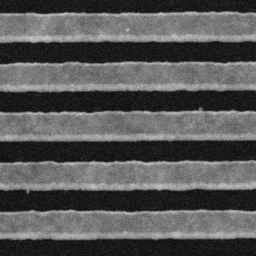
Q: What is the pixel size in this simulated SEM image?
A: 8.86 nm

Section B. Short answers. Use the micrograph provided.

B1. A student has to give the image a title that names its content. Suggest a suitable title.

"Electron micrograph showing lines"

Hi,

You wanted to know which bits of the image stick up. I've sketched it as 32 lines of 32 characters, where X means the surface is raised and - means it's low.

--------------------------------
--------------------------------
XXXXXXXXXXXXXXXXXXXXXXXXXXXXXXXX
XXXXXXXXXXXXXXXXXXXXXXXXXXXXXXXX
XXXXXXXXXXXXXXXXXXXXXXXXXXXXXXXX
--------------------------------
--------------------------------
--------------------------------
XXXXXXXXXXXXXXXXXXXXXXXXXXXXXXXX
XXXXXXXXXXXXXXXXXXXXXXXXXXXXXXXX
XXXXXXXXXXXXXXXXXXXXXXXXXXXXXXXX
--------------------------------
--------------------------------
--------------------------------
XXXXXXXXXXXXXXXXXXXXXXXXXXXXXXXX
XXXXXXXXXXXXXXXXXXXXXXXXXXXXXXXX
XXXXXXXXXXXXXXXXXXXXXXXXXXXXXXXX
--------------------------------
--------------------------------
--------------------------------
XXXXXXXXXXXXXXXXXXXXXXXXXXXXXXXX
XXXXXXXXXXXXXXXXXXXXXXXXXXXXXXXX
XXXXXXXXXXXXXXXXXXXXXXXXXXXXXXXX
XXXXXXXXXXXXXXXXXXXXXXXX-XXXXXXX
--------------------------------
--------------------------------
--XXXXXXXXXXXXXX-XXXXXXXXXXXXXXX
XXXXXXXXXXXXXXXXXXXXXXXXXXXXXXXX
XXXXXXXXXXXXXXXXXXXXXXXXXXXXXXXX
XXXXXXXXXXXXXXXXXXXXXXXXXXXXXXXX
--------------------------------
--------------------------------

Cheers